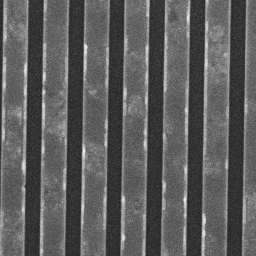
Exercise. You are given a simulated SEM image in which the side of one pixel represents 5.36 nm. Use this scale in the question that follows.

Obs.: parallel lines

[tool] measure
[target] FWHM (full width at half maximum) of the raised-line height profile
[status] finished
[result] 133 nanometers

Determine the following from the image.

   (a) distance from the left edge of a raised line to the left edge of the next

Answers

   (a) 216 nanometres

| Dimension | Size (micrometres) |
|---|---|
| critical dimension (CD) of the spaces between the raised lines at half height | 0.0843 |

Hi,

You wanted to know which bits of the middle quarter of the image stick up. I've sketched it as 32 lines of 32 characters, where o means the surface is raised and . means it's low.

o....oooooo....oooooo....oooooo.
o....oooooo....oooooo....oooooo.
o....oooooo....oooooo....oooooo.
o....oooooo....oooooo....oooooo.
o....oooooo....oooooo....o..ooo.
o....oooooo....oooooo....oooooo.
o....oooooo....oooooo....oooooo.
o....oooooo....oooooo....oooooo.
o....oooooo....oooooo....oooooo.
o....oooooo....oooooo....oooooo.
o....oooooo....oooooo....oooooo.
o....oooooo....oooooo....oooooo.
o....oooooo....oooooo....oooooo.
o....oooooo....oooooo....oooooo.
o....oooooo....oooooo....oooooo.
o....oooooo....oooooo....oooooo.
o....oooooo....oooooo....oooooo.
o....oooooo....oooooo....oooooo.
o....oooooo....oooooo....oooooo.
o....oooooo....oooooo....oooooo.
o....oooooo....oooooo....oooooo.
o....oooooo....oooooo....oooooo.
.....oooooo....oooooo....oooooo.
.....o.o..o....oooo......oooooo.
.....oooo.o....oooo.o....oooooo.
.....oooooo....oooooo....oooo.o.
.....oooooo....oooooo....oooooo.
.....oooooo....oooooo....oooooo.
.....oooooo....oooooo....oooooo.
.....oooooo....ooooo.....oooooo.
.....oooooo....ooooo.....oooooo.
.....oooooo....ooooo.....oooooo.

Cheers